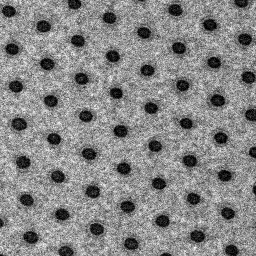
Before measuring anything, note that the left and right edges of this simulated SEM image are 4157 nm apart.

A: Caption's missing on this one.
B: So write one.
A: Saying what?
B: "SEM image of a regular array of holes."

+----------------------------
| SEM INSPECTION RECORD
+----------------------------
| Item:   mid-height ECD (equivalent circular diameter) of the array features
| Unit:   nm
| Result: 221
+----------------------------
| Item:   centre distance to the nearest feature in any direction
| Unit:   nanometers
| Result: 609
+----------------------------